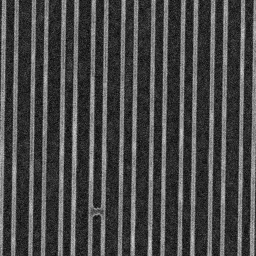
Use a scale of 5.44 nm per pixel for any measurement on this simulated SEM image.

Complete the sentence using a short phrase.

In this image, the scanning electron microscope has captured parallel lines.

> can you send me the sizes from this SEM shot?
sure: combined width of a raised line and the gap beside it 81.3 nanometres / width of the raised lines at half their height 21.1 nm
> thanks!